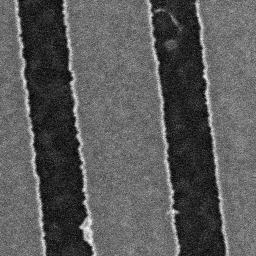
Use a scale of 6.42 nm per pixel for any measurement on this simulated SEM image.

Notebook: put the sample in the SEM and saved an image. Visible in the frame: one or a few lines or trenches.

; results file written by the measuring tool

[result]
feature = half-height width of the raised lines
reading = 85.7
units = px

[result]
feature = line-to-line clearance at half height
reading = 299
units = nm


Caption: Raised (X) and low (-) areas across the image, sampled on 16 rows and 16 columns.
X---XXXXX---XXXX
X---XXXXX---XXXX
X---XXXXXX---XXX
X---XXXXXX---XXX
X---XXXXXX---XXX
XX---XXXXX---XXX
XX---XXXXX---XXX
XX---XXXXX---XXX
XX---XXXXX---XXX
XX---XXXXX---XXX
XX---XXXXXX--XXX
XX---XXXXXX---XX
XX---XXXXXX---XX
XXX--XXXXXX---XX
XXX--XXXXXX---XX
XXX---XXXXX---XX